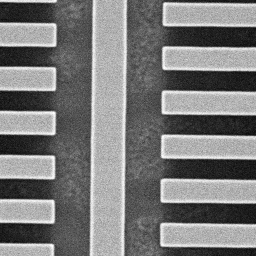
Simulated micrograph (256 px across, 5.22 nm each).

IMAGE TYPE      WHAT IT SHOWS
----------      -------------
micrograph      groups of lines, slits or small figures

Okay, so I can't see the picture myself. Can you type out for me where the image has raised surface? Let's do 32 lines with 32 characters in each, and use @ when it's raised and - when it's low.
------------@@@@-----@@@@@@@@@@-
------------@@@@----@@@@@@@@@@@@
------------@@@@----@@@@@@@@@@@@
@@@@@@@-----@@@@----------------
@@@@@@@-----@@@@----------------
@@@@@@@-----@@@@----------------
------------@@@@----@@@@@@@@@@@@
------------@@@@----@@@@@@@@@@@@
@@@@@@@-----@@@@----@@@@@@@@@@@@
@@@@@@@-----@@@@----------------
@@@@@@@-----@@@@----------------
------------@@@@-----@@@@-------
------------@@@@----@@@@@@@@@@@@
------------@@@@----@@@@@@@@@@@@
@@@@@@@-----@@@@----------------
@@@@@@@----@@@@@----------------
@@@@@@@----@@@@@----------------
-----------@@@@@----@@@@@@@@@@@@
-----------@@@@@----@@@@@@@@@@@@
@@---------@@@@@----@@@@@@@@@@@@
@@@@@@@----@@@@@----------------
@@@@@@@----@@@@-----------------
-----------@@@@-----@@@@@@@@@---
-----------@@@@-----@@@@@@@@@@@@
-----------@@@@-----@@@@@@@@@@@@
@@@@@@@----@@@@-----------------
@@@@@@@----@@@@-----------------
@@@@@@@----@@@@-----------------
-----------@@@@-----@@@@@@@@@@@@
-----------@@@@-----@@@@@@@@@@@@
@@@--------@@@@-----@@@@@@@@@@@@
@@@@@@@----@@@@-----------------